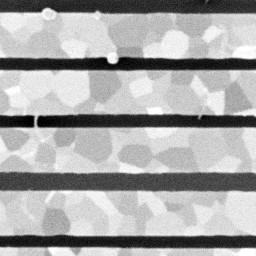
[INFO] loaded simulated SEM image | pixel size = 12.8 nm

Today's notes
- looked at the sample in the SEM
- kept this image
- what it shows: lines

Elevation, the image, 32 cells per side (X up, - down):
--------------------------------
-----XX-------------------------
XXXXXXXXXXXXXXXXXXXXXXXXXXXXXXXX
XXXXXXXXXXXXXXXXXXXXXXXXXXXXXXXX
XXXXXXXXXXXXXXXXXXXXXXXXXXXXXXXX
XXXXXXXXXXXXXXXXXXXXXXXXXXXXXXXX
XXXXXXXXXXXXXXXXXXXXXXXXXXXXXXXX
-------------XX-----------------
--------------------------------
XXXXXXXXXXXXXXXXXXXXXXXXXXXXXXXX
XXXXXXXXXXXXXXXXXXXXXXXXXXXXXXXX
XXXXXXXXXXXXXXXXXXXXXXXXXXXXXXXX
XXXXXXXXXXXXXXXXXXXXXXXXXXXXXXXX
XXXXXXXXXXXXXXXXXXXXXXXXXXXXXXXX
----X---------------------------
--------------------------------
XXXXXXXXXXXXXXXXXXXXXXXXXXXXXXXX
XXXXXXXXXXXXXXXXXXXXXXXXXXXXXXXX
XXXXXXXXXXXXXXXXXXXXXXXXXXXXXXXX
XXXXXXXXXXXXXXXXXXXXXXXXXXXXXXXX
XXXXXXXXXXXXXXXXXXXXXXXXXXXXXXXX
XXXXXXXXXXXXXXXXXXXXXXXXXXXXXXXX
--------------------------------
--------------------------------
XXXXXXXXXXXXXXXXXXXXXXXXXXXXXXXX
XXXXXXXXXXXXXXXXXXXXXXXXXXXXXXXX
XXXXXXXXXXXXXXXXXXXXXXXXXXXXXXXX
XXXXXXXXXXXXXXXXXXXXXXXXXXXXXXXX
XXXXXXXXXXXXXXXXXXXXXXXXXXXXXXXX
--------------------------------
--------------------------------
XXXXXXXXXXXXXXXXXXXXXXXXXXXXXXXX